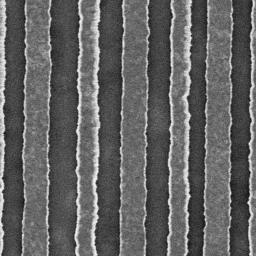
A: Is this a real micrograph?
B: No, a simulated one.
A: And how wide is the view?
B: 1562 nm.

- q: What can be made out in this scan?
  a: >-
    lines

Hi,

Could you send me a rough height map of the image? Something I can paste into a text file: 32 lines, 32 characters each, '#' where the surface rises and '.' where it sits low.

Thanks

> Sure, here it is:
...###....##...####..###..###...
...###....##...###....##..###..#
#..###....##...###....##..###..#
#..###....##...####..###..###...
#..###....##...####..###..###..#
...###....##...###...###..###..#
...###....##...###...###..###..#
#..###....##...###...###..###..#
...###....##...###...###..###...
#..###....##...###...###..###..#
...###....##...###...###..###..#
...###....##...###...##...###..#
...###....##...###...##...###..#
...###....##...###...##...###..#
...###....##...###...###..###..#
...###....##...###...##...###..#
...###....##...###...##...###..#
...###....##...###...##...###..#
...###....##...###...##...###..#
...###....##...###...##...###..#
...###....##...###...##...###..#
...###....##...###...##...###..#
...###....##...###...##...###..#
...###....##...###...###..###..#
...###....##...###...###..###..#
...###....##...###...##...###..#
...###....##...###...##...###..#
...###....##...###...##...###..#
...###....##...###...##...###..#
...###...###...###...##...###..#
...###....##...###...##...###..#
...###....##...###...##..####..#